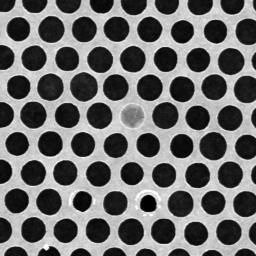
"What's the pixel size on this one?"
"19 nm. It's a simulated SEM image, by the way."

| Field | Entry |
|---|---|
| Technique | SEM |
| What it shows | a regular array of holes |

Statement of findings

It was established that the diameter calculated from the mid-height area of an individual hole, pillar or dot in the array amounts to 482 nanometers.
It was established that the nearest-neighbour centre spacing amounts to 0.613 µm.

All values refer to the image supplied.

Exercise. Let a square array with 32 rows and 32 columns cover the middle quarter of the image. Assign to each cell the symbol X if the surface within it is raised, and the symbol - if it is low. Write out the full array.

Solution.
---XXX------XX------XXX-----XXX-
--XXXXX----XXXX----XXXXX---XXXXX
XXX---XXXXXXXXXXXXXXXXXXXXXXXXXX
XX------XXX----XXXX-----XXXX---X
XX------XX------XXX-----XXX-----
XX------XX------XX-------XX-----
XX------XX------XX-------X------
XX------XX------XXX-----XXX-----
XXX----XXXX----XXXX----XXXX-----
XXXXXXXXXXXXXXXXXXXXXXXXX-XXX-XX
---XXXX----XXXXXXXXXXXX-----XXXX
----XX------XXXXXXXXXX------XXX-
----XX------XXXXXXXXXX-------XX-
----XX------XXXXXXXXXX-------X--
----XX------XXXXXXXXXX------XXX-
---XXXX----XXXXXXXXXXXX-----XXX-
XXXXXXXXXXXXXXXXXXXXXXXXXXXXXXXX
XXX---XXXXXX---XXXXX--XXXXXXX-XX
XX-----XXXX----XXX------XXX-----
XX------XX------XX------XXX-----
XX------XX------XX------XX------
XX------XX------XX------XXX-----
XXX----XXXX----XXXX----XXXX-----
XXXXXXXXXXXXXXXXXXXXXXXXXXXX--XX
--XXXXXX-XXXXXXXX-XXXXXXXXXXXXXX
---XXX-----XXXX----XXXX----XXXX-
---XXX------XX------XX------XXX-
----X-------XX------XX------XX--
---XXX------XX------XX------XX--
---XXX-----XXXX----XXX-----XXXX-
XXXXXXX---XXXXXXXXXXXXX----XXXXX
XXXXXXXXXXXXXXXXXXXXXXXXXXXXXXXX